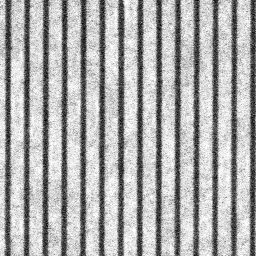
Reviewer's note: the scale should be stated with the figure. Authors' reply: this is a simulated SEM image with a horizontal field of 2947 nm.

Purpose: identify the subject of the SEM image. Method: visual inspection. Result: parallel lines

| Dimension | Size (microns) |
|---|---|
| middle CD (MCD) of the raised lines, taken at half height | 0.148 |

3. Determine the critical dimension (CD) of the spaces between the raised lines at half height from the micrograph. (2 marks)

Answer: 0.0691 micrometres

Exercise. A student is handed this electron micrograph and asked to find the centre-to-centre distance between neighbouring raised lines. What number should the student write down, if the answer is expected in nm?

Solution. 217